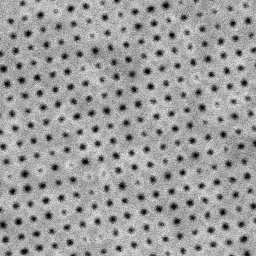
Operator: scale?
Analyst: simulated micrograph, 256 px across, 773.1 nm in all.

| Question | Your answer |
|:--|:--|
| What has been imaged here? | a regular array of holes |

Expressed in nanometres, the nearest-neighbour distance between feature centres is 45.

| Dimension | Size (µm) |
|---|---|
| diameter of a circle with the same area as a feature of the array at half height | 0.0186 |